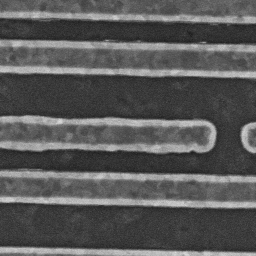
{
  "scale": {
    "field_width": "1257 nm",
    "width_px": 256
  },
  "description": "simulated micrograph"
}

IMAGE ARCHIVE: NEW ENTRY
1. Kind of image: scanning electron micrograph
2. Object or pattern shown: one or a few lines or trenches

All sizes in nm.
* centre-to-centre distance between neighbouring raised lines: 320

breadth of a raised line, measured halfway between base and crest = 127 nm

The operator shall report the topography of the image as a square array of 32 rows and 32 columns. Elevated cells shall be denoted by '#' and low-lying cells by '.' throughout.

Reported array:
################################
################################
............................####
................................
................................
####.#..........................
################################
################################
################################
................................
................................
................................
................................
................................
................................
#########################.......
###########################....#
###########################....#
...................##.####.....#
................................
................................
................................
################################
################################
################################
......................##########
................................
................................
................................
................................
................................
###########.....................